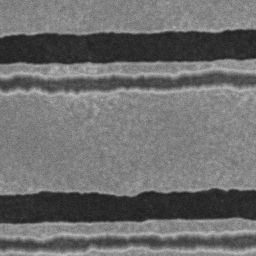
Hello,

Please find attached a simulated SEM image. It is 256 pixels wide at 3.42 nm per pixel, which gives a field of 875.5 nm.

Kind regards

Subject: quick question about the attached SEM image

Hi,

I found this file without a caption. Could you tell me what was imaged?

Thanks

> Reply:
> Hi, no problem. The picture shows lines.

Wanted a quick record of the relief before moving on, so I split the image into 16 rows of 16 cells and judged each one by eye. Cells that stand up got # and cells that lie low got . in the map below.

################
################
................
................
################
################
################
################
################
################
################
################
................
................
################
################